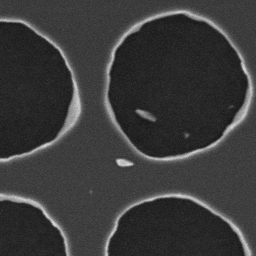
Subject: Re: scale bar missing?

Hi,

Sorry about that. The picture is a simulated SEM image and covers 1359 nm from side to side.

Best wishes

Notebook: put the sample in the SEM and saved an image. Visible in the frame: holes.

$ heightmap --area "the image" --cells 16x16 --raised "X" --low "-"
XXXXXXXXXXXXXXXX
-XXXXXXXX----XXX
---XXXXX------XX
----XXX--------X
----XXX--------X
-----XX---------
----XXX--------X
----XXX--------X
----XXXX------XX
--XXXXXXX---XXXX
XXXXXXXXXXXXXXXX
XXXXXXXXXXXXXXXX
XXXXXXXXXX--XXXX
---XXXXX------XX
----XXX--------X
----XXX--------X